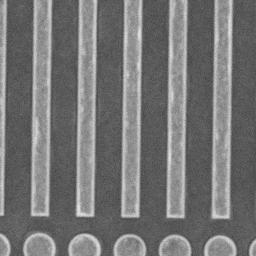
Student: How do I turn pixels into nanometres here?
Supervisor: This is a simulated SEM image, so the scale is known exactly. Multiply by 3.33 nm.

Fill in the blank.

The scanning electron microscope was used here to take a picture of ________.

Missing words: groups of lines, slits or small figures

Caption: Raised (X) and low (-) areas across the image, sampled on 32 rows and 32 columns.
X---XX----XX----XX---XX----XX---
X---XX----XX----XX---XX----XX---
X---XX----XX----XX---XX----XX---
X---XX----XX----XX---XX----XX---
X---XX----XX----XX---XX----XX---
X---XX----XX----XX---XX----XX---
X---XX----XX----XX---XX----XX---
X---XX----XX----X----XX----XX---
X---XX----XX----X----XX----XX---
X---XX----XX----X----XX----XX---
X---XX----XX----X----XX----XX---
X---XX----XX----X----XX----XX---
X---XX----XX---XX----XX----XX---
X---XX----XX---XX----XX----XX---
X---XX----XX---XX----XX----XX---
X---XX----XX---XX----XX----XX---
----XX----XX---XX----XX----XX---
----XX----XX---XX----XX----XX---
----XX----XX---XX----XX----XX---
----XX----XX---XX----XX----XX---
----XX----XX---XX----XX----XX---
----XX----XX---XX----XX----XX---
----XX----XX---XX----XX----XX---
----XX----XX---XX----XX----XX---
----XX----XX---XX----XX----XX---
----XX----XX---XX----XX----XX---
----XX----XX---XX----XX----XX---
--------------------------------
--------------------------------
----XX----X-----X---------------
X--XXXX--XXX---XXX--XXXX--XXX---
X--XXXX--XXX--XXXX--XXXX--XXX--X